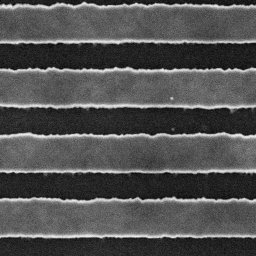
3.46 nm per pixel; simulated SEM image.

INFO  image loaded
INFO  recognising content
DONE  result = lines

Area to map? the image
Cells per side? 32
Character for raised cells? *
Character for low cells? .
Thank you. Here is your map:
.......*..**.....*.**..*........
********************************
********************************
********************************
********************************
................................
................................
................................
......*.......**................
********************************
********************************
********************************
********************************
..........................*.....
................................
................................
................................
********************************
********************************
********************************
********************************
.***.....*..**************......
................................
................................
................................
********************************
********************************
********************************
********************************
********************************
................................
................................